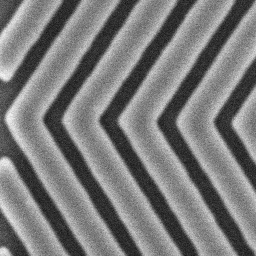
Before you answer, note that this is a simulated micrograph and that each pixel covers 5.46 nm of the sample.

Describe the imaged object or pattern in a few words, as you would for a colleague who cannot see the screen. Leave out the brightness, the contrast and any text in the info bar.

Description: groups of lines, slits or small figures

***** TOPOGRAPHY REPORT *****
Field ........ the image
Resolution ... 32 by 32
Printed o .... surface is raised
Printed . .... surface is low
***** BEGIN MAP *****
...oooo...ooooo..ooooo..ooooo...
..ooooo..ooooo..ooooo...oooo...o
.ooooo...oooo...ooooo..ooooo..oo
.oooo...ooooo..ooooo..ooooo...oo
ooooo..ooooo...oooo...oooo...ooo
oooo...oooo...oooo...ooooo..oooo
ooo...ooooo..ooooo..ooooo...oooo
ooo..ooooo...oooo...oooo...ooooo
oo...oooo...ooooo..ooooo..ooooo.
o...ooooo..ooooo..ooooo...oooo..
...ooooo...oooo...oooo...ooooo..
...oooo...oooo...ooooo..ooooo...
..ooooo..ooooo..ooooo...oooo...o
.ooooo...oooo...ooooo..ooooo..oo
.oooo...oooo...ooooo..ooooo...oo
.oooo...oooo...ooooo..ooooo..ooo
.ooooo...oooo...oooo...oooo...oo
..ooooo..ooooo..ooooo..ooooo..oo
...oooo...oooo...oooo...oooo...o
...ooooo..ooooo..ooooo..ooooo..o
o...oooo...oooo...ooooo..ooooo..
oo...oooo...oooo...oooo...oooo..
ooo..ooooo..ooooo..ooooo..ooooo.
ooo...oooo...oooo...oooo...oooo.
oooo..ooooo..ooooo...oooo...oooo
ooooo..oooo...ooooo..ooooo..oooo
ooooo...oooo...oooo...oooo...ooo
.ooooo..ooooo..ooooo..ooooo..ooo
..oooo...oooo...oooo...oooo...oo
..ooooo..ooooo...oooo...oooo...o
...oooo...ooooo..ooooo..ooooo..o
o...oooo...oooo...oooo...oooo...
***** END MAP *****